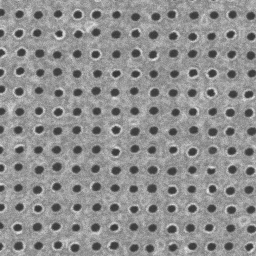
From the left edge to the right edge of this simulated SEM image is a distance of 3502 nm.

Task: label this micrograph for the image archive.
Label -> a regular array of holes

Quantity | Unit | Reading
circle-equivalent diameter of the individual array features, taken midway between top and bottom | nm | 124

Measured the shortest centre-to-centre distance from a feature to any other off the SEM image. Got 0.248 micrometres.